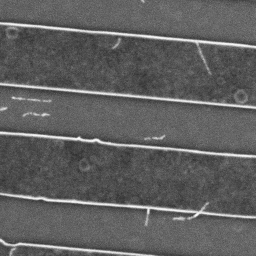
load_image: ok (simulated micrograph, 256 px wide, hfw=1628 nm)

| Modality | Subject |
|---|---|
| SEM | one or a few lines or trenches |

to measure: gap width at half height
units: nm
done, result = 307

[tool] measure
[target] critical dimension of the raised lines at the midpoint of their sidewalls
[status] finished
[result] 386 nm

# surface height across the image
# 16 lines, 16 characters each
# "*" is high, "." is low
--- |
................
*...............
************....
****************
****************
...*************
..............**
................
***.............
************....
****************
****************
...*************
..............**
................
****............